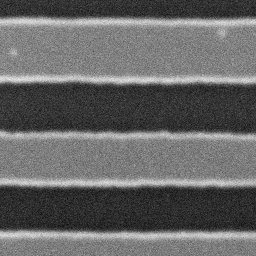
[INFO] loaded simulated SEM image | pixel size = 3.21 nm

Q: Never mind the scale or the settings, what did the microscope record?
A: lines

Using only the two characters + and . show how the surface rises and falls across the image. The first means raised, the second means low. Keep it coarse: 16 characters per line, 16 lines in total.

................
++++++++++++++++
++++++++++++++++
++++++++++++++++
++++++++++++++++
................
................
................
++++++++++++++++
++++++++++++++++
++++++++++++++++
................
................
................
................
++++++++++++++++